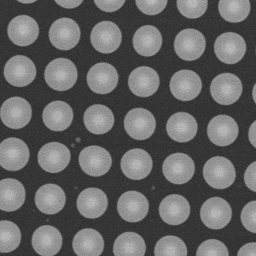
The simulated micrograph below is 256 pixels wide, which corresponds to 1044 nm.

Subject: an array of small figures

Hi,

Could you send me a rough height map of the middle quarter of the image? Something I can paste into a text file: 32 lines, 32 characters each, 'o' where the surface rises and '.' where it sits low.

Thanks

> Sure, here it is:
ooo....ooooo....................
ooo...ooooooo.....oooo..........
ooo...ooooooo....oooooo.....oooo
ooo...ooooooo...oooooooo...ooooo
ooo...ooooooo...oooooooo...ooooo
oo....ooooooo...oooooooo..oooooo
o......ooooo.....oooooo....ooooo
..................oooo.....ooooo
............................oooo
................................
o......ooo......................
oo....oooooo.....oooo...........
oo...ooooooo....oooooo.....oooo.
oo...oooooooo..oooooooo...oooooo
oo...ooooooo...oooooooo...oooooo
o....ooooooo...oooooooo...oooooo
......ooooo....oooooooo...oooooo
........o.......oooooo....oooooo
.................oooo......ooooo
.............................o..
.......o........................
o....ooooo.......ooo............
oo..ooooooo....oooooo......ooo..
o...oooooooo..oooooooo....oooooo
o...oooooooo..oooooooo...ooooooo
o...oooooooo..oooooooo...ooooooo
.....oooooo...oooooooo...ooooooo
......oooo.....oooooo....ooooooo
................oooo.....ooooooo
..........................ooooo.
................................
.....oooo.......................